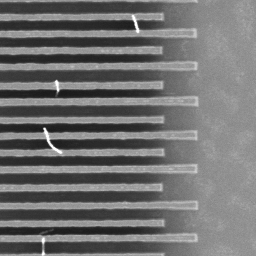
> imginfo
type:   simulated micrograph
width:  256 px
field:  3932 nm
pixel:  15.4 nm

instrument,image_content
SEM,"parallel lines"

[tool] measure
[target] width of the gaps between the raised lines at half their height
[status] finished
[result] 156 nm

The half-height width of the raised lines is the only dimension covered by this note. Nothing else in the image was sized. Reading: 113 nm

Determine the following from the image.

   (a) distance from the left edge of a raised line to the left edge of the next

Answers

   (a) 261 nm